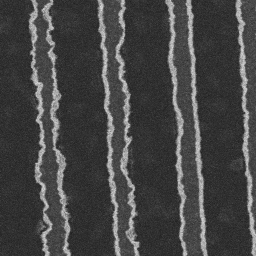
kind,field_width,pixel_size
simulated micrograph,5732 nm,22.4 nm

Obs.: one or a few lines or trenches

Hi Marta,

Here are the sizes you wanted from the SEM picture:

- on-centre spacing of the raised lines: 1550 nm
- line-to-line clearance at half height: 1.1 µm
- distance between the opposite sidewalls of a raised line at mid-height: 433 nm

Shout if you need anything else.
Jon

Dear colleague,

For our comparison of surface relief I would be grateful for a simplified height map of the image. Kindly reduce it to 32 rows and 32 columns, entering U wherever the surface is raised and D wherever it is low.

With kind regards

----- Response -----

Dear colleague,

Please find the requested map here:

DDDDUUDDDDDDDUUDDDDDDUUUDDDDDDUU
DDDDUUDDDDDDDUUDDDDDDUUUDDDDDDUU
DDDDUUDDDDDDDUUDDDDDDUUUDDDDDDUU
DDDDUUDDDDDDDUUUDDDDDDUUDDDDDDUU
DDDDUUDDDDDDDUUDDDDDDDUUDDDDDDUU
DDDDUUUDDDDDDUUDDDDDDUUUDDDDDDUU
DDDDUUDDDDDDDUUDDDDDDUUUDDDDDDUU
DDDDUUUDDDDDDUUDDDDDDUUUDDDDDDUU
DDDDUUUDDDDDDUUDDDDDDUUUDDDDDDUU
DDDDUUUDDDDDDUUDDDDDDDUUDDDDDDUU
DDDDDUUDDDDDDUUUDDDDDDUUDDDDDDDU
DDDDDUUDDDDDDUUUDDDDDDUUDDDDDDDU
DDDDDUUDDDDDDUUUDDDDDDUUDDDDDDDU
DDDDDUUDDDDDDUUUDDDDDDUUDDDDDDDU
DDDDDUUDDDDDDDUUDDDDDDUUDDDDDDDU
DDDDDUUDDDDDDDUUDDDDDDDUUDDDDDDU
DDDDDUUDDDDDDDUUDDDDDDDUUDDDDDDU
DDDDDUUDDDDDDDUUDDDDDDUUUDDDDDDU
DDDDDUUDDDDDDDUUDDDDDDUUUDDDDDDU
DDDDDUUDDDDDDDUUDDDDDDUUUDDDDDDU
DDDDDUUUDDDDDDUDDDDDDDUUUDDDDDDU
DDDDDUUUDDDDDDUUDDDDDDUUUDDDDDDU
DDDDDUUUDDDDDDUUDDDDDDUUUDDDDDDU
DDDDDUUUDDDDDDUUUDDDDDUUUDDDDDDU
DDDDDUUUDDDDDDUUDDDDDDDUUDDDDDDU
DDDDDDUUDDDDDDUUUDDDDDDUUDDDDDDU
DDDDDDUUDDDDDDUUUDDDDDDUUDDDDDDU
DDDDDDUUDDDDDDUUDDDDDDDUUDDDDDDU
DDDDDDUUDDDDDDUUDDDDDDDUUDDDDDDU
DDDDDUUUDDDDDDUUDDDDDDDUUDDDDDDD
DDDDDDUUDDDDDDDUUDDDDDDUUDDDDDDD
DDDDDDUUDDDDDDDUUDDDDDDUUUDDDDDD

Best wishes